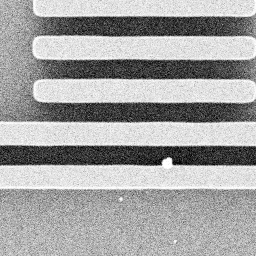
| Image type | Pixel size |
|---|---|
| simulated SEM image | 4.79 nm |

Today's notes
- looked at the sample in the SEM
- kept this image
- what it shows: groups of lines, slits or small figures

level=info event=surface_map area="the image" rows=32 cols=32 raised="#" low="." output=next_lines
....############################
....############################
................................
................................
................................
....############################
....############################
................................
................................
................................
....############################
....############################
.....###########################
................................
................................
################################
################################
################################
................................
................................
....................##..........
################################
################################
.......###########..###.....####
................................
................................
................................
................................
................................
................................
................................
................................